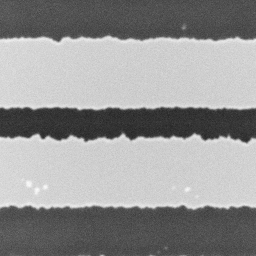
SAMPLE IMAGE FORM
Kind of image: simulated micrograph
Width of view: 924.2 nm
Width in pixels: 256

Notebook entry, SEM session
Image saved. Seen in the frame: lines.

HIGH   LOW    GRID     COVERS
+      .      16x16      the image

................
................
+++.++++.+++..+.
++++++++++++++++
++++++++++++++++
++++++++++++++++
++++++++++++++++
................
................
++++++++++++++++
++++++++++++++++
++++++++++++++++
++++++++++++++++
................
................
................